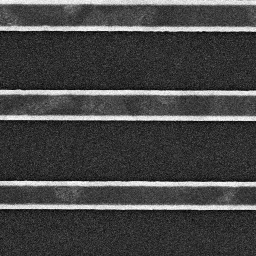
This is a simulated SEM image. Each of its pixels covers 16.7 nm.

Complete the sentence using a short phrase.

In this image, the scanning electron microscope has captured one or a few lines or trenches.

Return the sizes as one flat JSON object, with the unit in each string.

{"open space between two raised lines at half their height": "1070 nm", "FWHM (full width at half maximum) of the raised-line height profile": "444 nm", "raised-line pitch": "1.5 microns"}